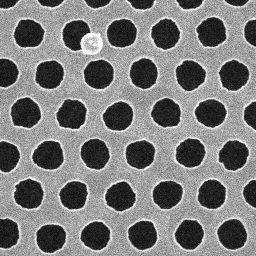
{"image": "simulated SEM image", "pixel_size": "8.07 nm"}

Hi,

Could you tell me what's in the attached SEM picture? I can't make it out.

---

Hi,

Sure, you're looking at a regular array of holes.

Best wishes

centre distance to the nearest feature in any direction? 358 nm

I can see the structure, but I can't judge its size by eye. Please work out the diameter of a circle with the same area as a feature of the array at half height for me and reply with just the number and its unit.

241 nm